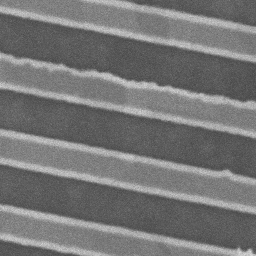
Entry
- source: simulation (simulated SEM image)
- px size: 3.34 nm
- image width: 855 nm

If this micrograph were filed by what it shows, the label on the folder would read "one or a few lines or trenches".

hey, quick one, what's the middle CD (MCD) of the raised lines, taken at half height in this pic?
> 93.9 nm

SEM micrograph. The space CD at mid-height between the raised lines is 155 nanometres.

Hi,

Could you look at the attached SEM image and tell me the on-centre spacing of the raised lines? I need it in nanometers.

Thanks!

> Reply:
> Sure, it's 248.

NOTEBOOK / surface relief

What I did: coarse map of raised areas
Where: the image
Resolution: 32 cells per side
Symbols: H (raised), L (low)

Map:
HHHHHHHHHHHHHHHLLLLLLLLLLLLLLLLL
LLHHHHHHHHHHHHHHHHHHLLLLLLLLLLLL
LLLLLLLHHHHHHHHHHHHHHHHHHLLLLLLL
LLLLLLLLLLLLHHHHHHHHHHHHHHHHHHHL
LLLLLLLLLLLLLLLLLHHHHHHHHHHHHHHH
LLLLLLLLLLLLLLLLLLLLLLLHHHHHHHHH
LLLLLLLLLLLLLLLLLLLLLLLLLLLLHHHH
HHLLLLLLLLLLLLLLLLLLLLLLLLLLLLLL
HHHHHHHLLLLLLLLLLLLLLLLLLLLLLLLL
HHHHHHHHHHHHHLLLLLLLLLLLLLLLLLLL
HHHHHHHHHHHHHHHHLLLLLLLLLLLLLLLL
LLLLLHHHHHHHHHHHHHHHHHLLLLLLLLLL
LLLLLLLLLLHHHHHHHHHHHHHHHHHLLLLL
LLLLLLLLLLLLLLLHHHHHHHHHHHHHHHHH
LLLLLLLLLLLLLLLLLLLLHHHHHHHHHHHH
LLLLLLLLLLLLLLLLLLLLLLLLLHHHHHHH
LLLLLLLLLLLLLLLLLLLLLLLLLLLLLLHH
HHHHHLLLLLLLLLLLLLLLLLLLLLLLLLLL
HHHHHHHHHHLLLLLLLLLLLLLLLLLLLLLL
HHHHHHHHHHHHHHHLLLLLLLLLLLLLLLLL
LLHHHHHHHHHHHHHHHHHHLLLLLLLLLLLL
LLLLLLLHHHHHHHHHHHHHHHHHHHLLLLLL
LLLLLLLLLLLLHHHHHHHHHHHHHHHHHHHL
LLLLLLLLLLLLLLLLLHHHHHHHHHHHHHHH
LLLLLLLLLLLLLLLLLLLLLLLHHHHHHHHH
LLLLLLLLLLLLLLLLLLLLLLLLLLLLHHHH
HHHLLLLLLLLLLLLLLLLLLLLLLLLLLLLL
HHHHHHHHLLLLLLLLLLLLLLLLLLLLLLLL
HHHHHHHHHHHHHLLLLLLLLLLLLLLLLLLL
HHHHHHHHHHHHHHHHHHLLLLLLLLLLLLLL
LLLLLHHHHHHHHHHHHHHHHHHLLLLLLLLL
LLLLLLLLLLHHHHHHHHHHHHHHHHHHLLLL